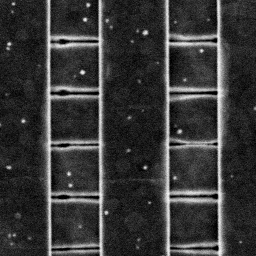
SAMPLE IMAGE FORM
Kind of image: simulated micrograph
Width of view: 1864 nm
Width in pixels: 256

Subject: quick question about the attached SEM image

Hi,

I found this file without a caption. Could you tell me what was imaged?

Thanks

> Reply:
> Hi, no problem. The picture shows wiring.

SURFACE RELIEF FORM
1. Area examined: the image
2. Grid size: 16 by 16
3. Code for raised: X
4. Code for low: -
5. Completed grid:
XXX---XXXX----XX
XXX---XXXXX---XX
XXX---XXXXX---XX
XXX---XXXXX---XX
XXX---XXXXX---XX
XXX---XXXXX---XX
XXX---XXXXX---XX
XXX---XXXXX---XX
XXX---XXXXX---XX
XXX---XXXXX---XX
XXX---XXXXX---XX
XXX---XXXXX---XX
XXX---XXXXX---XX
XXX---XXXXX---XX
XXX---XXXXX---XX
XXX---XXXXX---XX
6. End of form